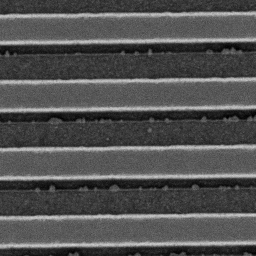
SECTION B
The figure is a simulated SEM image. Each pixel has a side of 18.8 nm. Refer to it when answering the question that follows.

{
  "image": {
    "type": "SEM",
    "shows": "lines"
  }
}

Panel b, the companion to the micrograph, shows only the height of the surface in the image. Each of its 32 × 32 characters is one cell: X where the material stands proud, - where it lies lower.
--------------------------------
--------------------------------
XXXXXXXXXXXXXXXXXXXXXXXXXXXXXXXX
XXXXXXXXXXXXXXXXXXXXXXXXXXXXXXXX
XXXXXXXXXXXXXXXXXXXXXXXXXXXXXXXX
--------------------------------
--------------------------------
--------------------------------
--------------------------------
--------------------------------
XXXXXXXXXXXXXXXXXXXXXXXXXXXXXXXX
XXXXXXXXXXXXXXXXXXXXXXXXXXXXXXXX
XXXXXXXXXXXXXXXXXXXXXXXXXXXXXXXX
XXXXXXXXXXXXXXXXXXXXXXXXXXXXXXXX
--------------------------------
--------------------------------
--------------------------------
--------------------------------
--XXXXXXXXXXXXXXXXXXXXXXXXXXXXXX
XXXXXXXXXXXXXXXXXXXXXXXXXXXXXXXX
XXXXXXXXXXXXXXXXXXXXXXXXXXXXXXXX
XXXXXXXXXXXXXXXXXXXXXXXXXXXXXXXX
--------------------------------
--------------------------------
--------------------------------
--------------------------------
--------------------------------
XXXXXXXXXXXXXXXXXXXXXXXXXXXXXXXX
XXXXXXXXXXXXXXXXXXXXXXXXXXXXXXXX
XXXXXXXXXXXXXXXXXXXXXXXXXXXXXXXX
XXXXXXXXXXXXXXXXXXXXXXXXXXXXXXXX
--------------------------------